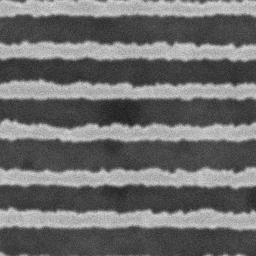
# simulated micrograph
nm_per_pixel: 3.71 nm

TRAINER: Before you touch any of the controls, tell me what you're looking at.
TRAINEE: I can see lines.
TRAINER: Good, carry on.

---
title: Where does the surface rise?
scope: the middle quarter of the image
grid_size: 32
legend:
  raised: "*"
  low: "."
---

................................
................................
................................
................................
................................
*****************...*..****.****
********************************
********************************
*.....******.....*...........***
................................
................................
................................
................................
................................
................................
.....***....****..*..*****..****
*.******************************
********************************
***********.********************
................................
................................
................................
................................
................................
................................
................................
.............**......***....*...
********************************
********************************
********************************
...*...*....................*...
................................